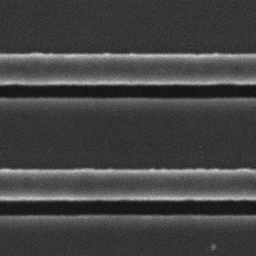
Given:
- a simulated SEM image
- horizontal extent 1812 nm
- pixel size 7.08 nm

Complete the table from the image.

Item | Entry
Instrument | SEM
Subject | lines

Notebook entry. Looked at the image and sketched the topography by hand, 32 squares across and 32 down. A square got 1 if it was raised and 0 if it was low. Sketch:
11111111111111111111111111111111
11111111111111111111111111111111
11111111111111111111111111111111
11111111111111111111111111111111
11111111111111111111111111111111
11111111111111111111111111111111
11111111111111111111111111111111
11111111111111111111111111111111
11111111111111111111111111111111
11111111111111111111111111111111
00000000000000000000000000000000
00000000000000000000000000000000
11111111111111111111111111111111
11111111111111111111111111111111
11111111111111111111111111111111
11111111111111111111111111111111
11111111111111111111111111111111
11111111111111111111111111111111
11111111111111111111111111111111
11111111111111111111111111111111
11111111111111111111111111111111
11111111111111111111111111111111
11111111111111111111111111111111
11111111111111111111111111111111
11111111111111111111111111111111
00000000000000000000000000000000
00000000000000000000000000000000
11111111111111111111111111111111
11111111111111111111111111111111
11111111111111111111111111111111
11111111111111111111111111111111
11111111111111111111111111111111